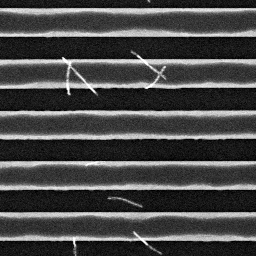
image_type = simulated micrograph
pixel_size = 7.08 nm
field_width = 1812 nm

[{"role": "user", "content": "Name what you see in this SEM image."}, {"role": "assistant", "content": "lines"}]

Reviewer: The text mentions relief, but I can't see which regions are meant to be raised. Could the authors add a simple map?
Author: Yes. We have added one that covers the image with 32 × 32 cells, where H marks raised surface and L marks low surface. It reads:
LLLLLLLLLLLLLLLLLLLLLLLLLLLLLLLL
HHHHHHHHHHHHHHHHHHHHHHHHHHHHHHHH
HHHHHHHHHHHHHHHHHHHHHHHHHHHHHHHH
HHHHHHHHHHHHHHHHHHHHHHHHHHHHHHHH
HHHHLLLLLLLLLLLLLLLLLLLHHHHLLLLL
LLLLLLLLLLLLLLLLLLLLLLLLLLLLLLLL
LLLLLLLLLLLLLLLLLLLLLLLLLLLLLLLL
LLLLLLLHHLLLLLLLLHLLLLLLLLLLLLLL
HHHHHHHHHHHHHHHHHHHHHHHHHHHHHHHH
HHHHHHHHHHHHHHHHHHHHHHHHHHHHHHHH
HHHHHHHHHHHHHHHHHHHHHHHHHHHHHHHH
LLLLLLLLLLLLLLLLLLLLLLLLLLLLLLLL
LLLLLLLLLLLLLLLLLLLLLLLLLLLLLLLL
LLLLLLLLLLLLLLLLLLLLLLLLLLLLLLLL
HHHHHHHHHHHHHHHHHHHHHHHHHHHHHHHH
HHHHHHHHHHHHHHHHHHHHHHHHHHHHHHHH
HHHHHHHHHHHHHHHHHHHHHHHHHHHHHHHH
LLLLLLLLLLLLLLLLLLLLLLLLLLLLLLLL
LLLLLLLLLLLLLLLLLLLLLLLLLLLLLLLL
LLLLLLLLLLLLLLLLLLLLLLLLLLLLLLLL
HHHHHHHHHHHHHHHHHHHHHHHHHHHHHHHH
HHHHHHHHHHHHHHHHHHHHHHHHHHHHHHHH
HHHHHHHHHHHHHHHHHHHHHHHHHHHHHHHH
HHHHHHHHHHHHHHHHHHHHHHHHHHHHHHHH
LLLLLLLLLLLLLLLLLLLLLLLLLLLLLLLL
LLLLLLLLLLLLLLLLLLLLLLLLLLLLLLLL
LLLLLLLLLLLLLLLLLLLLLLLLLLLLLLLL
HHHHHHHHHHHHHHHHHHHHHHHHHHHHHHHH
HHHHHHHHHHHHHHHHHHHHHHHHHHHHHHHH
HHHHHHHHHHHHHHHHHHHHHHHHHHHHHHHH
LLLLLLLLLLLLLLLLLLLLLLLLLLLLLLLL
LLLLLLLLLLLLLLLLLLLLLLLLLLLLLLLL